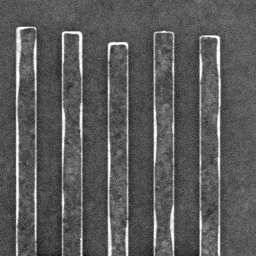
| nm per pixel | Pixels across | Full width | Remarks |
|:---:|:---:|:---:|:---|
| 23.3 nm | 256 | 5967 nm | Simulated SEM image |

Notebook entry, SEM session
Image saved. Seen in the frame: groups of lines, slits or small figures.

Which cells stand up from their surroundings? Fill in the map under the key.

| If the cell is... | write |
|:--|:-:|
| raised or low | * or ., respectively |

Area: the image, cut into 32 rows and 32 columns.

................................
................................
................................
...*............................
..**....**.........***..........
..**....**....**...***...**.....
..**....**....**...***...**.....
..**....**....**...***...**.....
..**....**....**...***...**.....
..**....**....**...***...**.....
..**....**....**...***...**.....
..**....**....**...***...**.....
..**....**....**...***...**.....
..**....**....**...***...**.....
..**....**....**...***...**.....
..**....**....**...***...**.....
..**....**....**...***...**.....
..**....**....**...***...**.....
..**....**....**...***...**.....
..**....**....**...***...**.....
..**....**....**...***...**.....
..**....**....**...***...**.....
..**....**....**...***...**.....
..**....**....**...***...**.....
..**....**....**...***...**.....
..**....**....**...***...**.....
..**....**....**...***...**.....
..**....**....**...**....**.....
..**....**....**...**....**.....
..**....**....**...***...**.....
..**....**....**...***...**.....
..**....**....**...***...**.....